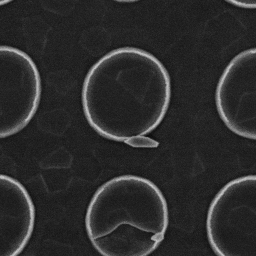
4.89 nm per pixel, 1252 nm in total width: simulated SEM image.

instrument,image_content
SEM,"raised bodies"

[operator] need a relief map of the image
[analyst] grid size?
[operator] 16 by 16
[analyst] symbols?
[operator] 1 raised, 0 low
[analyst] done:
0000000000000000
0000000000000000
0000000000000000
1100000110000001
1100001111000011
1100011111100011
1100011111000011
1100001111000011
0000000110000000
0000000000000000
0000000000000000
1000000110000011
1100001111000111
1100011111000111
1100001111000111
1000001111000111